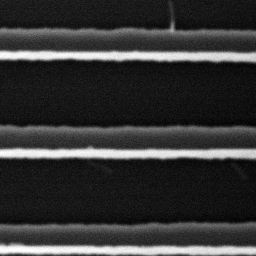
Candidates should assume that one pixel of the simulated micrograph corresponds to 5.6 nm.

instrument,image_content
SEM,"lines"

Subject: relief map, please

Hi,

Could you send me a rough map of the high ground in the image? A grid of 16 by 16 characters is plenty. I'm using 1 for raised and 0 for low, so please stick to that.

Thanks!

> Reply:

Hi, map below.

0000000000000000
0000000000000000
1111111111111111
1111111111111111
0000000000000000
0000000000000000
0000000000000000
0000000000000000
1111111111111111
1111111111111111
0000000000000000
0000000000000000
0000000000000000
0000000000000000
1111111111111111
1111111111111111